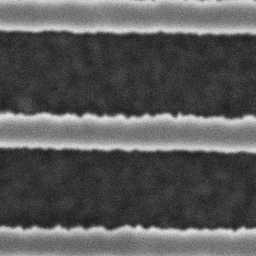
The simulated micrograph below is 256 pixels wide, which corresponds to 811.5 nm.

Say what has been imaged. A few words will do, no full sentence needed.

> lines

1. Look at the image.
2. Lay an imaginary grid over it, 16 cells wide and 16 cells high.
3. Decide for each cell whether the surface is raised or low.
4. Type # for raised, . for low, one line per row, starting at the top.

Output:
################
################
................
................
................
................
................
################
################
..............#.
................
................
................
................
################
################